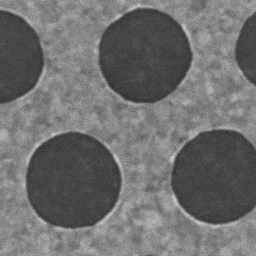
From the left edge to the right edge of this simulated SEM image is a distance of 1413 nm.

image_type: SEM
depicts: holes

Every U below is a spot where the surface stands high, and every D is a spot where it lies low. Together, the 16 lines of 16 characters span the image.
UUUUUUUUUUUUUUUU
DDUUUUUDDDDUUUUD
DDDUUUDDDDDDUUUD
DDDUUUDDDDDDUUUD
DDDUUUDDDDDDUUUD
DDUUUUUDDDDUUUUU
UUUUUUUUUUUUUUUU
UUUUUUUUUUUUUUUU
UUUDDDUUUUUUDDDU
UUDDDDDUUUUDDDDD
UUDDDDDUUUUDDDDD
UUDDDDDDUUUDDDDD
UUDDDDDUUUUDDDDD
UUDDDDDUUUUUDDDU
UUUUUUUUUUUUUUUU
UUUUUUUUUUUUUUUU